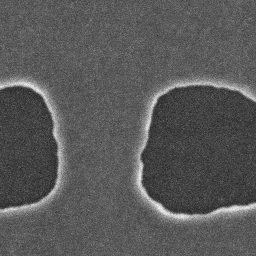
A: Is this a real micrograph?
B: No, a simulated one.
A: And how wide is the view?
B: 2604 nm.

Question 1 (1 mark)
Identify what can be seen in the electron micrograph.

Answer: holes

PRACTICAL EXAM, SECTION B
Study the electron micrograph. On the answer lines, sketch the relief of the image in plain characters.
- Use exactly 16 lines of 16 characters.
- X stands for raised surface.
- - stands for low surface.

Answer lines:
XXXXXXXXXXXXXXXX
XXXXXXXXXXXXXXXX
XXXXXXXXXXXXXXXX
XXXXXXXXXXXXXXXX
XXXXXXXXXXXXXXXX
--XXXXXXXXX---XX
---XXXXXXX------
---XXXXXX-------
---XXXXXX-------
----XXXXX-------
----XXXXX-------
---XXXXXX-------
---XXXXXXX------
XXXXXXXXXXXXXXXX
XXXXXXXXXXXXXXXX
XXXXXXXXXXXXXXXX